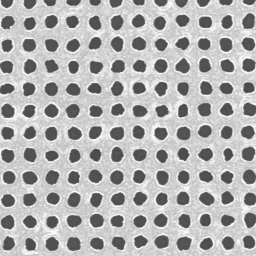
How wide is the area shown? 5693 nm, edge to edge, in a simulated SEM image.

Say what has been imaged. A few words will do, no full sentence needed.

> a regular array of holes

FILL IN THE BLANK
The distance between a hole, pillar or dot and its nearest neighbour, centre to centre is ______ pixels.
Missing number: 21.3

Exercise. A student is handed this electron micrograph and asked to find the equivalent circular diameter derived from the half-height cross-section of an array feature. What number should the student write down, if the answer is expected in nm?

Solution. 300